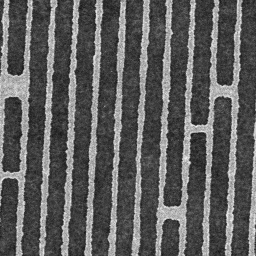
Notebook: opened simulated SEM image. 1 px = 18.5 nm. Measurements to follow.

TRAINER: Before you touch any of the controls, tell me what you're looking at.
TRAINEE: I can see parallel lines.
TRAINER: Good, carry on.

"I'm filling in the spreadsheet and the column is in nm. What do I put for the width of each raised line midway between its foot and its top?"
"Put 97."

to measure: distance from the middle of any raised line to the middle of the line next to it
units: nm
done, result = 430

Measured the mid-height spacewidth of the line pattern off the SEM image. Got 330 nm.